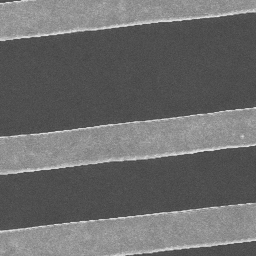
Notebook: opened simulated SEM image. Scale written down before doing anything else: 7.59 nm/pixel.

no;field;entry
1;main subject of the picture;lines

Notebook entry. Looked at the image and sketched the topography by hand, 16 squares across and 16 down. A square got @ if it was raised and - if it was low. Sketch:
@@@@@@@@@@@@@@@@
@@@@@@@@@-------
----------------
----------------
----------------
----------------
----------------
----------@@@@@@
-@@@@@@@@@@@@@@@
@@@@@@@@@@@@----
@@@@------------
----------------
----------------
--------@@@@@@@@
@@@@@@@@@@@@@@@@
@@@@@@@@@@@@----